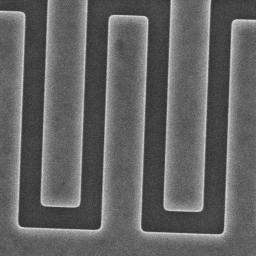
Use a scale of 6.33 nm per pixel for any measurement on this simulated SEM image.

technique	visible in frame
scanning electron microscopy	groups of lines, slits or small figures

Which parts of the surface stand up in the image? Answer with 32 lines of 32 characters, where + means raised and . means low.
......+++++..........+++++......
+.....+++++..........+++++......
+++...+++++...++++...+++++......
+++...+++++...++++...+++++...+++
+++...+++++...++++...+++++...+++
+++...+++++...++++...+++++...+++
+++...+++++...++++...+++++...+++
+++...+++++...++++...+++++...+++
+++...+++++..+++++...+++++...+++
+++...++++...+++++...+++++...+++
+++...++++...+++++...+++++...+++
+++...++++...+++++...+++++...+++
+++...++++...+++++...+++++...+++
+++...++++...+++++...+++++...+++
+++...++++...+++++...+++++...+++
+++...++++...+++++...+++++...+++
+++..+++++...+++++...+++++..++++
++...+++++...+++++...+++++..++++
++...+++++...+++++...+++++..++++
++...+++++...+++++...+++++..++++
++...+++++...+++++...+++++..++++
++...+++++...+++++...++++...++++
++...+++++...+++++...++++...++++
++...+++++...+++++...++++...++++
++...+++++...+++++...++++...++++
++...+++++...+++++...++++...++++
++...........+++++..........++++
++...........+++++..........++++
+++.........++++++..........++++
++++++++++++++++++++++++++++++++
++++++++++++++++++++++++++++++++
++++++++++++++++++++++++++++++++